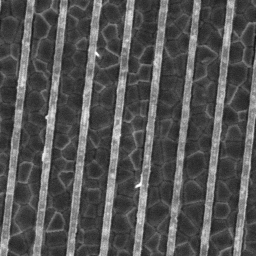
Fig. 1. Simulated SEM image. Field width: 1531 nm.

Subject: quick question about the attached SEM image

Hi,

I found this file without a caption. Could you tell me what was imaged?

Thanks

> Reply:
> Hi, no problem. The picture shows parallel lines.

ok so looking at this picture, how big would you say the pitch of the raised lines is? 198 nm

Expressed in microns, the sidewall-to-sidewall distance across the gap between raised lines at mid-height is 0.158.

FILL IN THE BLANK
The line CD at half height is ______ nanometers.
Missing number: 40.8